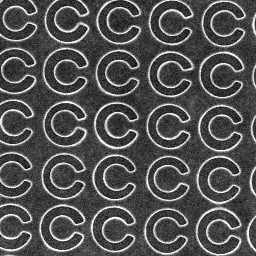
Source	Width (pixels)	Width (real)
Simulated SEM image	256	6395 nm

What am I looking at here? an array of small figures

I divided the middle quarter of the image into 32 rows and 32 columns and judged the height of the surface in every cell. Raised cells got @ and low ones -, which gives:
@@@--@@@@--@@@@@---@@@--@@@@@---
@@@@@@@@--@@@@@@@@@@@---@@@@@@@@
@@@@@@@@--@@@@@@@@@@@---@@@@@@@@
@@@@-@@@---@@@@@@@@@@---@@@@@@@@
@@@--@@@@--@@@@@--@@@@--@@@@@---
-----@@@@----@----@@@@---@@@---@
----@@@@@@-------@@@@@@-------@@
-@@@@@@@@@@@---@@@@@@@@@-----@@@
@@@@@@@@@@@@@@@@@@@@@@@@@@@@@@@@
-@@@@@@@@@@@@@@@@@@@@@@@@@@@@@@@
---@@@@@@@------@@@@@@@@----@@@@
-----@@@@--------@@@@@@-------@@
@@---@@@----@@@---@@@@---@@----@
@@@--@@@---@@@@@--@@@---@@@@@--@
@@@@@@@@---@@@@@@@@@@--@@@@@@@@@
@@@@@@@@---@@@@@@@@@@--@@@@@@@@@
@@@--@@@---@@@@@@@@@@--@@@@@@@@@
@@---@@@---@@@@@--@@@---@@@@@--@
-----@@@@---------@@@@---@@@---@
----@@@@@@-------@@@@@@-------@@
-@@@@@@@@@@----@@@@@@@@@-----@@@
@@@@@@@@@@@@@@@@@@@@@@@@@@@@@@@@
@@@@@@@@@@@@@@@@@@@@@@@@@@@@@@@@
---@@@@@@@-----@@@@@@@@@@---@@@@
----@@@@@--------@@@@@@-------@@
@@---@@@---@@@@--@@@@@---@@----@
@@@--@@@--@@@@@@--@@@--@@@@@@--@
@@@@@@@---@@@@@@@@@@@--@@@@@@@@@
@@@@@@@---@@@@@@@@@@@--@@@@@@@@@
@@@-@@@@--@@@@@@@@@@@--@@@@@@@@@
@@---@@@---@@@@@--@@@--@@@@@@--@
----@@@@----@@---@@@@@--@@@@---@